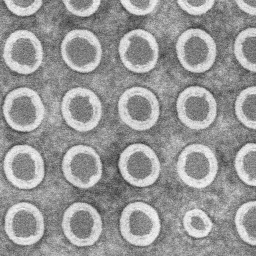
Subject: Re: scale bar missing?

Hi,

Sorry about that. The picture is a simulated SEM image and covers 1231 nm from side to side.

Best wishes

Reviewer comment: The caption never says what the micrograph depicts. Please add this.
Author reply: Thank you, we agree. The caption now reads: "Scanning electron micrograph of a regular array of raised bodies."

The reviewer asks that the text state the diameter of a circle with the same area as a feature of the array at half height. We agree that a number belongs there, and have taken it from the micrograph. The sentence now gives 182 nm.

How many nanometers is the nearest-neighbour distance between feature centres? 275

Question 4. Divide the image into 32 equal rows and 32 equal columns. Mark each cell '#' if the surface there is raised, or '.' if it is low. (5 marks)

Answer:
.####...####...####....###....##
..##.....##......#......#......#
................................
................................
..##.....###....###....###....##
.####...####...####...#####...##
.####...####...####...#####...##
.####...####....###....###....##
..##......#.....###.....#......#
................................
................................
..##.....##.....##.....###.....#
.####...####...####....####...##
.####...####...#####..#####...##
.####...####...####....####...##
.###.....###....###.....##.....#
................................
................................
..#.............##......#......#
.####...####...####....####...##
.####...####...#####..#####...##
.####...####...#####..#####...##
.####....###....###....###.....#
................................
................................
...............................#
.####...####....###.....#.....##
.####...####...#####...###....##
.####...####...#####...###....##
.####....###....###...........##
................................
................................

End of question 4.